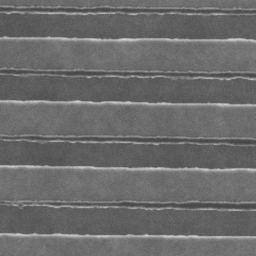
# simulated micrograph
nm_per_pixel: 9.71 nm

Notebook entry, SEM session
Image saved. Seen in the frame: lines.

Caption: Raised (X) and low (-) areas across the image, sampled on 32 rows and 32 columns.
XXXXXXXXXXXXXXXXXXXXXXXXXXXXXXXX
XXXXXXXXXXXXXXXXXXXXXXXXXXXXXXXX
--------------------------------
--------------------------------
--------------------------------
XXXXXXXXXXXXXXXXXXXXXXXXXXXXXXXX
XXXXXXXXXXXXXXXXXXXXXXXXXXXXXXXX
XXXXXXXXXXXXXXXXXXXXXXXXXXXXXXXX
XXXXXXXXXXXXXXXXXXXXXXXXXXXXXXXX
--XX----XXXXXXXXXXXXXXXXXXXXXXXX
--------------------------------
--------------------------------
--------------------------------
XXXXXXXXXXXXXXXXXXXXXXXXXXXXXXXX
XXXXXXXXXXXXXXXXXXXXXXXXXXXXXXXX
XXXXXXXXXXXXXXXXXXXXXXXXXXXXXXXX
XXXXXXXXXXXXXXXXXXXXXXXXXXXXXXXX
XXXXXXXXXXXXXXXXXXXXXXXXXXXXXXXX
--------------------------------
--------------------------------
--------------------------------
XXXXXXXXXXXXXXXXXXXXXXXXXXXXXXXX
XXXXXXXXXXXXXXXXXXXXXXXXXXXXXXXX
XXXXXXXXXXXXXXXXXXXXXXXXXXXXXXXX
XXXXXXXXXXXXXXXXXXXXXXXXXXXXXXXX
XXXXXXXXXXXXXXXXXXXXXXXXXXXXXXXX
--------------------------------
--------------------------------
--------------------------------
XXXXXXXXXXXXXXXXXXXXXXXXX-------
XXXXXXXXXXXXXXXXXXXXXXXXXXXXXXXX
XXXXXXXXXXXXXXXXXXXXXXXXXXXXXXXX